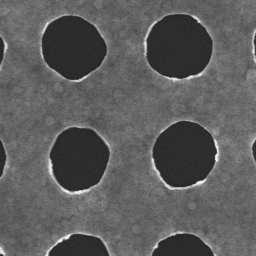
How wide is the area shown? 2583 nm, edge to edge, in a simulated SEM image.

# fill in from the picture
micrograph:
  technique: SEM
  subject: holes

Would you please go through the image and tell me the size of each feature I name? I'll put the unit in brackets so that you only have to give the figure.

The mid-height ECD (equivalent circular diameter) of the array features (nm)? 647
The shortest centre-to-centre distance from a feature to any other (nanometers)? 1070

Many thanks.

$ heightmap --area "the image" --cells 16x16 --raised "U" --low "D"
UUUUUUUUUUUUUUUU
UUUDDDUUUUDDDUUU
UUUDDDUUUDDDDUUU
UUUDDDDUUDDDDUUU
UUUUDDUUUUDDUUUU
UUUUUUUUUUUUUUUU
UUUUUUUUUUUUUUUU
UUUUUUUUUUUUUUUU
UUUUDDUUUUDDDUUU
UUUDDDDUUUDDDUUU
UUUDDDDUUUDDDUUU
UUUUDDUUUUDDUUUU
UUUUUUUUUUUUUUUU
UUUUUUUUUUUUUUUU
UUUUUUUUUUUUUUUU
UUUDDDDUUUDDDUUU